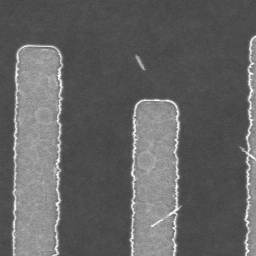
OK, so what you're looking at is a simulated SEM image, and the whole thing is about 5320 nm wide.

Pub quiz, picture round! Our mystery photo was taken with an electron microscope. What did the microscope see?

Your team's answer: one or a few lines or trenches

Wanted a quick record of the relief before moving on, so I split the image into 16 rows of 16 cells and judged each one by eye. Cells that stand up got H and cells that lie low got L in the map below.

HHHHHHHHHHHHHHHH
HHHHHHHHHHHHHHHH
HHHHHHHHHHHHHHHH
HLLLHHHHHHHHHHHH
HLLLHHHHHHHHHHHH
HLLLHHHHHHHHHHHH
HLLLHHHHHLLHHHHH
HLLLHHHHLLLHHHHH
HLLLHHHHLLLHHHHH
HLLLHHHHLLLHHHHH
HLLLHHHHLLLHHHHH
HLLLHHHHLLLHHHHH
HLLLHHHHLLLHHHHH
HLLLHHHHLLLHHHHL
HLLLHHHHLLLHHHHH
HLLHHHHHLLLHHHHL